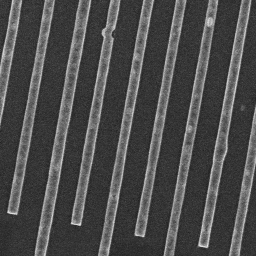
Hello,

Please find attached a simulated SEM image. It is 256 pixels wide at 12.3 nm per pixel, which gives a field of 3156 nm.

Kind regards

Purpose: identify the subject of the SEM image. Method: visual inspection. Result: parallel lines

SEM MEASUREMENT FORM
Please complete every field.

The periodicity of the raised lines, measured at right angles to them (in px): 32.2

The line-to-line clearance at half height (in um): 0.287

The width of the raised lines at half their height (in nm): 111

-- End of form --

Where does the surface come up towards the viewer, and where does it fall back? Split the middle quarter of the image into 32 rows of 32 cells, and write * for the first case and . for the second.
.***.....**......**......**.....
.**......**......**......**.....
***.....***......**......**.....
***.....***......**......**.....
***.....**......***......**.....
***.....**......**......***.....
***.....**......**......**......
**.....***......**......**......
**.....***......**......**......
**.....***......**......**......
**.....**......***......**......
**.....**......**......***......
**.....**......**......**......*
*.....***......**......**......*
*.....***......**......**......*
*.....**......***......**......*
*.....**......**......***......*
*.....**......**......**......**
......**......**......**......**
.....***......**......**......**
.....***......**......**......**
.....**......***......**......**
.....**......**......***.....***
.....**......**......**......***
....***......**......**......**.
....***......**......**......**.
....***......**......**......**.
....**......***......**......**.
....**......**......***......**.
....**......**......**......***.
...***......**......**......**..
...***......**......**......**..